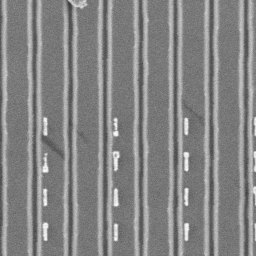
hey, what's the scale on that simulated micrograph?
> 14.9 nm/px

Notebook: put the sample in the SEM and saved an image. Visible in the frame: wiring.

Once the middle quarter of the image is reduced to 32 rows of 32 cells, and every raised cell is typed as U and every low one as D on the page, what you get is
UDDUUUUUUDDUUUUUUUDDUUUUUUUDDUUU
UDDUUUUUUDDUUUUUUUDDUUUUUUUDDUUU
UDDUUUUUUDDUUUUUUUDDUUUUUUUDDUUU
UDDUUUUUUDDUUUUUUUDDUUUUUUUDDUUU
UDDUUUUUUDDUUUUUUUDDUUUUUUUDDUUU
UDDUUUUUUDDUUUUUUUDDUUUUUUUDDUUU
DDDUUUUUUDDUUUUUUUDDUUUUUUUDDUUU
DDDUUUUUUDDUUUUUUUDDUUUUUUUDDUUU
DDDUUUUUUDDUUUUUUUDDUUUUUUUDDUUU
DDDUUUUUUDDUUUUUUUDDUUUUUUUDDUUU
DDDUUUUUUDDUUUUUUUDDUUUUUUUDDUUU
DDDUUUUUUDDUUUUUUUDDUUUUUUUDDUUU
DDDUUUUUUDDUUUUUUUDDUUUUUUUDDUUU
DDDUUUUUUDDUUUUUUUDDUUUUUUUDDUUU
DDDUUUUUUDDUUUUUUUDDUUUUUUUDDUUU
DDDUUUUUUDDUUUUUUUDDUUUUUUUDDUUU
DDDUUUUUUDDUUUUUUUDDUUUUUUUDDUUU
DDDUUUUUUDDUUUUUUUDDUUUUUUUDDUUU
DDDUUUUUUDDDUUUUUUDDUUUUUUUDDUUU
UDDUUUUUUDDDUUUUUUDDUUUUUUUDDUUU
UDDUUUUUUDDUUUUUUUDDUUUUUUUDDUUU
UDDUUUUUUDDUUUUUUUDDUUUUUUUDDUUU
UDDUUUUUUDDUUUUUUUDDUUUUUUUDDUUU
UDDUUUUUUDDUUUUUUUDDUUUUUUUDDUUU
UDDUUUUUUDDUUUUUUUDDUUUUUUUDDUUU
UDDUUUUUUDDUUUUUUUDDUUUUUUUDDUUU
UDDUUUUUUDDUUUUUUUDDUUUUUUUDDUUU
UDDUUUUUUDDUUUUUUUDDUUUUUUUDDUUU
UDDUUUUUUDDUUUUUUUDDUUUUUUUDDUUU
UDDUUUUUUDDDUUUUUUDDUUUUUUUDDUUU
UDDUUUUUUDDDUUUUUUDDUUUUUUUDDUUU
UDDUUUUUUDDDUUUUUUDDUUUUUUUDDUUU